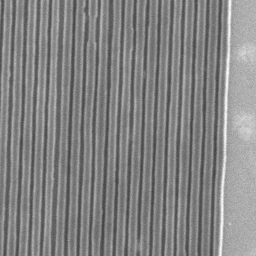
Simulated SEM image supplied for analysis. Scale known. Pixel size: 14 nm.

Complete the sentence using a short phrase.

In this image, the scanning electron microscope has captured parallel lines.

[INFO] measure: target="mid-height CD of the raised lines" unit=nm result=110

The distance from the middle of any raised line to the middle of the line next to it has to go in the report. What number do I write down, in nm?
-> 169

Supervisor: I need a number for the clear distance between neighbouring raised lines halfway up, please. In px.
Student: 4.37